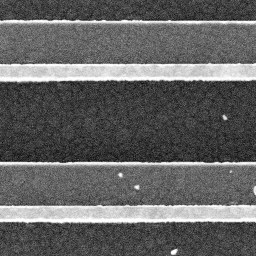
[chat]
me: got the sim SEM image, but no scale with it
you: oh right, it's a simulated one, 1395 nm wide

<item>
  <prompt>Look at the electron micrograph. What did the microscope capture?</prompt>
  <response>lines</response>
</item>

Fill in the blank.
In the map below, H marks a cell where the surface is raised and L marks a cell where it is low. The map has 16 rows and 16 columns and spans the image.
LLLLLLLLLLLLLLLL
HHHHHHHHHHHHHHHH
HHHHHHHHHHHHHHHH
HHHHHHHHHHHHHHHH
HHHHHHHHHHHHHHHH
LLLLLLLLLLLLLLLL
LLLLLLLLLLLLLLLL
LLLLLLLLLLLLLLLL
LLLLLLLLLLLLLLLL
LLLLLLLLLLLLLLLL
HHHHHHHHHHHHHHHH
HHHHHHHHHHHHHHHH
HHHHHHHHHHHHHHHH
HHHHHHHHHHHHHHHH
LLLLLLLLLLLLLLLL
LLLLLLLLLLLLLLLL